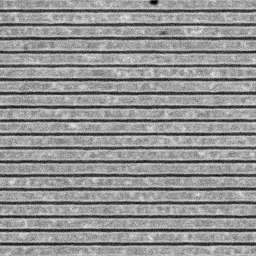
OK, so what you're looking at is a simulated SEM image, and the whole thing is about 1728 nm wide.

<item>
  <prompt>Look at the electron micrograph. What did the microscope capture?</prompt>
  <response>parallel lines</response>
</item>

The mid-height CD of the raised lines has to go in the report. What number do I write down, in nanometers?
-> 67.5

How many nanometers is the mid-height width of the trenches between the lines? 24.5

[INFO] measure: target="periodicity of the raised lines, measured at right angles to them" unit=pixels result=13.7